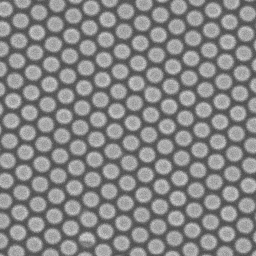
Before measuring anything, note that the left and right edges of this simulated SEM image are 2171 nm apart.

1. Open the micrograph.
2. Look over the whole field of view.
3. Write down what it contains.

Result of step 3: a regular array of raised bodies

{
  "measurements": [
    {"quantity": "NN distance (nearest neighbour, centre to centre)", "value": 168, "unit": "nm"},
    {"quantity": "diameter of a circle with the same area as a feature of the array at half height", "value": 121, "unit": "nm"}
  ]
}